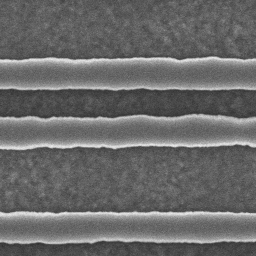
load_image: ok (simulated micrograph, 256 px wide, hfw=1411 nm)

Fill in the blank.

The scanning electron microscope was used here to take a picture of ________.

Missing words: lines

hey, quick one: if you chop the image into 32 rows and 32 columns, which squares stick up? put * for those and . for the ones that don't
................................
................................
................................
................................
................................
................................
................................
**.*****************************
********************************
********************************
********************************
................................
................................
................................
.................**....*****....
********************************
********************************
********************************
****..........*.................
................................
................................
................................
................................
................................
................................
................................
................................
********************************
********************************
********************************
................................
................................